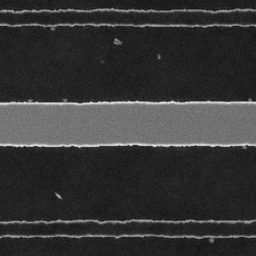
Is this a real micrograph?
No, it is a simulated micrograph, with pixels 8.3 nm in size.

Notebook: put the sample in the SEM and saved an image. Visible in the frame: lines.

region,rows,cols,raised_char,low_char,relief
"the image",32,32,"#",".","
................................
################################
################################
................................
................................
................................
................................
................................
................................
................................
................................
................................
................................
################################
################################
################################
################################
################################
................................
................................
................................
................................
................................
................................
................................
................................
................................
................................
################################
################################
................................
................................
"